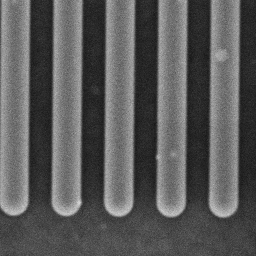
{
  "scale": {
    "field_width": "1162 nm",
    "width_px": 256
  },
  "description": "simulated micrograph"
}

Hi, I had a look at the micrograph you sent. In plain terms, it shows groups of lines, slits or small figures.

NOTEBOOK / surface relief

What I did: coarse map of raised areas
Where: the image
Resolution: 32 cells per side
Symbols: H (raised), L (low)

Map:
HHHHLLLHHHLLLHHHHLLLHHHLLLHHHHLL
HHHHLLLHHHLLLHHHHLLLHHHLLLHHHHLL
HHHHLLLHHHLLLHHHHLLLHHHLLLHHHHLL
HHHHLLLHHHLLLHHHHLLLHHHLLLHHHHLL
HHHHLLLHHHLLLHHHHLLLHHHLLLHHHHLL
HHHHLLLHHHLLLHHHHLLLHHHLLLHHHHLL
HHHHLLLHHHLLLHHHHLLLHHHLLLHHHHLL
HHHHLLLHHHLLLHHHHLLLHHHLLLHHHHLL
HHHHLLLHHHLLLHHHHLLLHHHLLLHHHHLL
HHHHLLLHHHLLLHHHHLLLHHHLLLHHHHLL
HHHHLLLHHHLLLHHHHLLLHHHLLLHHHHLL
HHHHLLLHHHLLLHHHHLLLHHHLLLHHHHLL
HHHHLLLHHHLLLHHHHLLLHHHLLLHHHHLL
HHHHLLLHHHLLLHHHHLLLHHHLLLHHHHLL
HHHHLLLHHHLLLHHHHLLLHHHLLLHHHHLL
HHHHLLLHHHLLLHHHHLLLHHHLLLHHHHLL
HHHHLLLHHHLLLHHHHLLLHHHLLLHHHHLL
HHHHLLLHHHLLLHHHHLLLHHHLLLHHHHLL
HHHHLLLHHHLLLHHHHLLLHHHLLLHHHHLL
HHHHLLLHHHLLLHHHHLLLHHHLLLHHHHLL
HHHLLLLHHHLLLHHHHLLLHHHLLLHHHHLL
HHHLLLLHHHLLLHHHHLLLHHHLLLHHHHLL
HHHLLLLHHHLLLHHHHLLLHHHLLLHHHHLL
HHHLLLLHHHLLLHHHHLLLHHHLLLHHHHLL
HHHLLLLHHHLLLHHHHLLLHHHLLLHHHHLL
HHHLLLLHHHLLLHHHHLLLHHHLLLHHHHLL
LHHLLLLHHLLLLLHHLLLLHHHLLLLHHLLL
LLLLLLLLLLLLLLLLLLLLLLLLLLLLLLLL
LLLLLLLLLLLLLLLLLLLLLLLLLLLLLLLL
LLLLLLLLLLLLLLLLLLLLLLLLLLLLLLLL
LLLLLLLLLLLLLLLLLLLLLLLLLLLLLLLL
LLLLLLLLLLLLLLLLLLLLLLLLLLLLLLLL